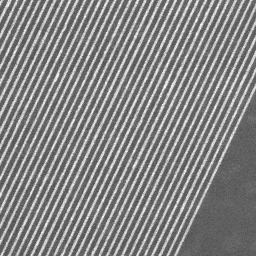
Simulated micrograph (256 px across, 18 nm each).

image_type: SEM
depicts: parallel lines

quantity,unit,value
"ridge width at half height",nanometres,34.5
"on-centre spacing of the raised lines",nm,123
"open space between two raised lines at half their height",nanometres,87.2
